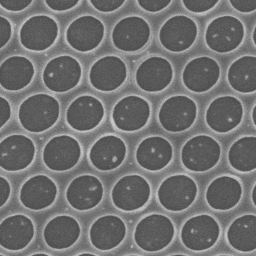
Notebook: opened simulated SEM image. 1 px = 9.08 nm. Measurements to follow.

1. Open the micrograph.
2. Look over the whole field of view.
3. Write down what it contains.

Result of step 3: a regular array of holes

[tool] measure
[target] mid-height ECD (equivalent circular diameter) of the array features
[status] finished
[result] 332 nm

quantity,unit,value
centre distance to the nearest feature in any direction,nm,415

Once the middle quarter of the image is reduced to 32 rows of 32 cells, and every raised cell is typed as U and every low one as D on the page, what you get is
DDDDUUUDDDDDDDDUUUUDDDDDDDDUUUDD
DDDDUUUDDDDDDDDDUUDDDDDDDDDUUUDD
DDDDUUDDDDDDDDDDUUDDDDDDDDDUUUDD
DDDDUUDDDDDDDDDDUUDDDDDDDDDUUUDD
DDDDUUUDDDDDDDDUUUDDDDDDDDDUUUDD
DDDUUUUDDDDDDDUUUUUDDDDDDDUUUUDD
DUUUUUUUUDDDUUUUUUUUDDDDDUUUUUUD
UUUUUUUUUUUUUUUUUUUUUUUUUUUUUUUU
UUUDDDDDUUUUUUUDDDDUUUUUUUUDDDDU
UUDDDDDDDUUUUUDDDDDDDUUUUDDDDDDD
UDDDDDDDDDUUUDDDDDDDDUUUDDDDDDDD
UDDDDDDDDDUUDDDDDDDDDDUUDDDDDDDD
UDDDDDDDDDUUDDDDDDDDDDUUDDDDDDDD
UDDDDDDDDDUUDDDDDDDDDUUUDDDDDDDD
UDDDDDDDDUUUUDDDDDDDDUUUDDDDDDDD
UUDDDDDDUUUUUDDDDDDDUUUUUDDDDDDD
UUUDDDUUUUUUUUUDDDUUUUUUUUDDDDUU
UUUUUUUUUUUUUUUUUUUUUUUUUUUUUUUU
DDUUUUUUUDDDDDUUUUUUUDDDDUUUUUUU
DDDUUUUUDDDDDDDUUUUDDDDDDDUUUUUD
DDDDUUUDDDDDDDDUUUUDDDDDDDDUUUDD
DDDDUUUDDDDDDDDDUUDDDDDDDDDUUDDD
DDDDUUDDDDDDDDDUUUDDDDDDDDDUUDDD
DDDDUUDDDDDDDDDUUUDDDDDDDDDUUDDD
DDDUUUUDDDDDDDDUUUDDDDDDDDUUUUDD
DDDUUUUUDDDDDDUUUUUDDDDDDUUUUUDD
DUUUUUUUUDDUUUUUUUUUUDDUUUUUUUUU
UUUUUUUUUUUUUUUUUUUUUUUUUUUUUUUU
UUUDDDDDUUUUUUDDDDDDUUUUUUDDDDDD
UUDDDDDDDUUUUDDDDDDDDUUUUDDDDDDD
UDDDDDDDDUUUUDDDDDDDDUUUDDDDDDDD
UDDDDDDDDDUUDDDDDDDDDDUUDDDDDDDD